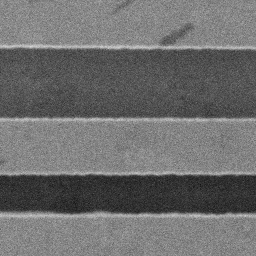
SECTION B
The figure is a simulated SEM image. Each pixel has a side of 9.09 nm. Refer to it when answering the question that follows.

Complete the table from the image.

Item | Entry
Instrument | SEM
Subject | lines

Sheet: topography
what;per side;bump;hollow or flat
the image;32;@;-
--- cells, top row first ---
@@@@@@@@@@@@@@@@@@@@@@@@@@@@@@@@
@@@@@@@@@@@@@@@@@@@@@@@@@@@@@@@@
@@@@@@@@@@@@@@@@@@@@@@@@@@@@@@@@
@@@@@@@@@@@@@@@@@@@@@@@@@@@@@@@@
@@@@@@@@@@@@@@@@@@@@@@@@@@@@@@@@
@@@@@@@@@@@@@@@@@@@@@@@@@@@@@@@@
--------------------------------
--------------------------------
--------------------------------
--------------------------------
--------------------------------
--------------------------------
--------------------------------
--------------------------------
--------------------------------
@@@@@@@@@@@@@@@@@@@@@@@@@@@@@@@@
@@@@@@@@@@@@@@@@@@@@@@@@@@@@@@@@
@@@@@@@@@@@@@@@@@@@@@@@@@@@@@@@@
@@@@@@@@@@@@@@@@@@@@@@@@@@@@@@@@
@@@@@@@@@@@@@@@@@@@@@@@@@@@@@@@@
@@@@@@@@@@@@@@@@@@@@@@@@@@@@@@@@
@@@@@@@@@@@@@@@@@@@@@@@@@@@@@@@@
--------------------------------
--------------------------------
--------------------------------
--------------------------------
--------------------------------
@@@@@@@@@@@@@@@@@@@@@@@@@@@@@@@@
@@@@@@@@@@@@@@@@@@@@@@@@@@@@@@@@
@@@@@@@@@@@@@@@@@@@@@@@@@@@@@@@@
@@@@@@@@@@@@@@@@@@@@@@@@@@@@@@@@
@@@@@@@@@@@@@@@@@@@@@@@@@@@@@@@@